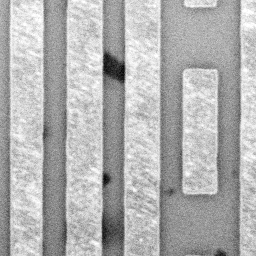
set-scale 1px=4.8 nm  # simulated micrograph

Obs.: wiring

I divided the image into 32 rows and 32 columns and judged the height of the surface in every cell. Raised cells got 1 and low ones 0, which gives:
01111000011110001111000111100011
01111000011110001111000000000011
01111000011110001111000000000011
01111000011110001111000000000011
01111000011110001111000000000011
01111000011110001111000000000011
01111000011110001111000000000011
01111000111110001111000000000011
01111000111110001111000000000011
01111000111110001111000111100011
01111000011110001111000111100011
01111000011110001111000111100011
01111000111110001111000111100011
01111000111110001111000111100011
01111000111110001111000111100011
01111000111110001111000111100011
01111000111110001111000111100011
01111000111110001111000111100011
01111000111110001111000111100011
01111000111110001111000111100011
01111000111110001111000111100011
01111000111110001111000111100011
01111000111110001111000111100011
01111000111110001111000111100011
01111000111110001111000000000011
01111000111110001111000000000011
01111000111110001111000000000011
01111000111110001111000000000011
01111000111110001111000000000011
01111000111110001111000000000011
01111000111110001111000000000011
01111000111110001111000000000011